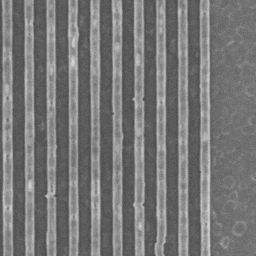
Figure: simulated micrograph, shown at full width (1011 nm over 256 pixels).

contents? parallel lines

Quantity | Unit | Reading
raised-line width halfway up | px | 8.76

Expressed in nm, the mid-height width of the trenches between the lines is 51.9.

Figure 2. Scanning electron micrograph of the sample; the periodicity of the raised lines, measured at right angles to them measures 0.0867 micrometres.